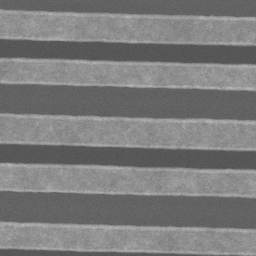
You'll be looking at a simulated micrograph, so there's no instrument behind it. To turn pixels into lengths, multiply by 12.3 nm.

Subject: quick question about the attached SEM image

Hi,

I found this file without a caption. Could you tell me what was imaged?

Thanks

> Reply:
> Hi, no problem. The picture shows lines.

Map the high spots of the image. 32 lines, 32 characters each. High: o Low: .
................................
oooooo..........................
oooooooooooooooooooooooooooooooo
oooooooooooooooooooooooooooooooo
oooooooooooooooooooooooooooooooo
.........................ooooooo
................................
ooooooooooo.....................
oooooooooooooooooooooooooooooooo
oooooooooooooooooooooooooooooooo
......oooooooooooooooooooooooooo
................................
................................
................................
ooooooooo.......................
oooooooooooooooooooooooooooooooo
oooooooooooooooooooooooooooooooo
oooooooooooooooooooooooooooooooo
..................oooooooooooooo
................................
oo..............................
oooooooooooooooooooooooooooooooo
oooooooooooooooooooooooooooooooo
oooooooooooooooooooooooooooooooo
............................oooo
................................
................................
................................
oooooooooooooooooooooooooo......
oooooooooooooooooooooooooooooooo
oooooooooooooooooooooooooooooooo
..............oooooooooooooooooo